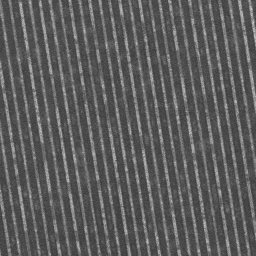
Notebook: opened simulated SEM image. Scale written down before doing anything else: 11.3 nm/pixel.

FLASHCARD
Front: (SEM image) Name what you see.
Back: parallel lines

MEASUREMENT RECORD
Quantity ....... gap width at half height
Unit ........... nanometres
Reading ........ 86.3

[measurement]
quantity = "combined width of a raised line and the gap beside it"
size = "0.111 um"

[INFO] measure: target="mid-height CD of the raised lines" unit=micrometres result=0.0194